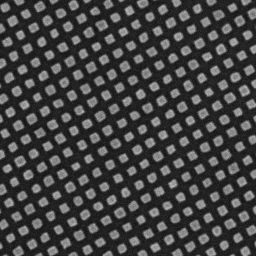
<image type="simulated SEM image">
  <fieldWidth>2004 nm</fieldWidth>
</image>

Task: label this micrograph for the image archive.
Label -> a regular array of raised bodies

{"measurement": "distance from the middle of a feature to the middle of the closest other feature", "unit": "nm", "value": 117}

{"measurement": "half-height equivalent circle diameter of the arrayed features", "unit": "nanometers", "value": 68.2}